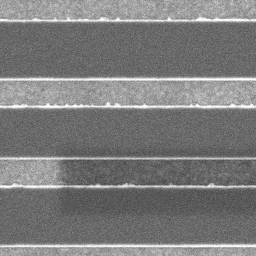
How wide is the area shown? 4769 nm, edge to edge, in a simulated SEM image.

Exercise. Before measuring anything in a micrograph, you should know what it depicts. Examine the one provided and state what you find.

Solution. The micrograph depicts lines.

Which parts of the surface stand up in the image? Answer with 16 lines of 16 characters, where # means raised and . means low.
................
################
################
################
################
................
................
################
################
################
................
................
################
################
################
................